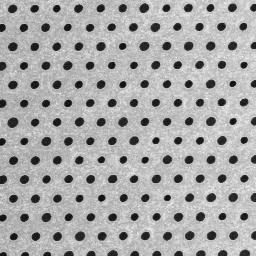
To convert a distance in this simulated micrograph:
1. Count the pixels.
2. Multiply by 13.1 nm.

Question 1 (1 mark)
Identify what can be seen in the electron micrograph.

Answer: a regular array of holes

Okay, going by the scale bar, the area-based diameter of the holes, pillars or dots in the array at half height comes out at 114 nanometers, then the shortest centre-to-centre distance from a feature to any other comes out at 281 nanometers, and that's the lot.